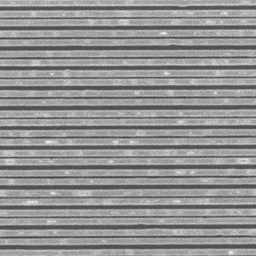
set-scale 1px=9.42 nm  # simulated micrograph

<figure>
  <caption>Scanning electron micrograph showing parallel lines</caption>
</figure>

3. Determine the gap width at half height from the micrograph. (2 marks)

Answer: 35.3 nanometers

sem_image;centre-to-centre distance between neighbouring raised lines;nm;93.1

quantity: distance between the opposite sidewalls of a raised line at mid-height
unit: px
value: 6.62